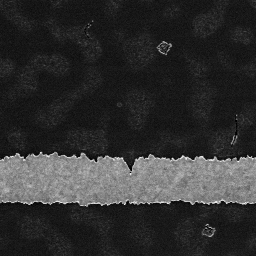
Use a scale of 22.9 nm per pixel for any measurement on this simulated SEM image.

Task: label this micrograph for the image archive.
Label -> one or a few lines or trenches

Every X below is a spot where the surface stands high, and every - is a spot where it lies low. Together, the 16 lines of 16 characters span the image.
----------------
----------------
----------------
----------------
----------------
----------------
----------------
----------------
----------------
----------------
XXXXXXXXXXXXXXXX
XXXXXXXXXXXXXXXX
XXXXXXXXXXXXXXXX
----------------
----------------
----------------